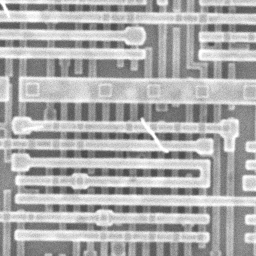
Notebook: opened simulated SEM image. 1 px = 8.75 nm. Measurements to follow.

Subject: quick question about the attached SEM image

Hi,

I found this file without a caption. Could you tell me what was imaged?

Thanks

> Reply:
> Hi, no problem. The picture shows wiring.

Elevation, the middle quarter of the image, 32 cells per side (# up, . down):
................................
................................
................................
................................
################################
################################
################################
################################
################################
................################
................................
................................
................................
................................
#############......#............
################################
################################
................................
................................
################################
################################
..........######################
................................
................................
################################
################################
................................
..###...........................
########################........
################################
..####.........#################
................................